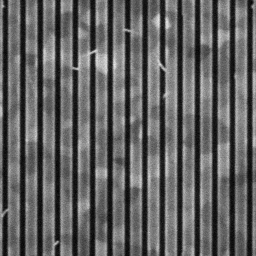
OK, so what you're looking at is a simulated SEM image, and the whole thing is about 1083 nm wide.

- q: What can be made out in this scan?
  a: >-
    parallel lines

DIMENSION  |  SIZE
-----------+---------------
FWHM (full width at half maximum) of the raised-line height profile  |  47.5 nm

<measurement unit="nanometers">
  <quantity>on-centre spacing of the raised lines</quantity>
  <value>73.7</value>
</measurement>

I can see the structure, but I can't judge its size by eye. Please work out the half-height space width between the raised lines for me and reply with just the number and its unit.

0.0259 micrometres